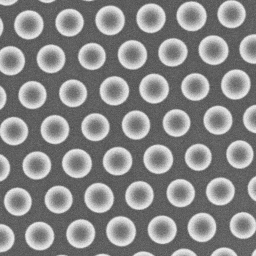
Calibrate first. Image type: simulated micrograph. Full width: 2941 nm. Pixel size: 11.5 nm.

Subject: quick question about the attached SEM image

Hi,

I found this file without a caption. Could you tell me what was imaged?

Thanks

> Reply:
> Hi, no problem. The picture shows an array of small figures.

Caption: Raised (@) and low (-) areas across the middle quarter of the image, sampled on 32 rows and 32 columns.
-----@@@@------@@@@-------------
--------------------------------
--------------------------------
-----------@@@------@@@@@-----@@
-@@@------@@@@@----@@@@@@@----@@
@@@@@----@@@@@@@---@@@@@@@---@@@
@@@@@----@@@@@@@---@@@@@@@---@@@
@@@@@@---@@@@@@@---@@@@@@@----@@
@@@@@----@@@@@@@----@@@@@------@
@@@@@-----@@@@@------@@@--------
-@@-----------------------------
----------------------------@---
----------------@@@@------@@@@--
-----@@@@@-----@@@@@@----@@@@@@-
@----@@@@@@----@@@@@@----@@@@@@-
@----@@@@@@----@@@@@@----@@@@@@-
@----@@@@@@----@@@@@@----@@@@@@-
@----@@@@@@----@@@@@@-----@@@@--
------@@@@-------@@-------------
--------------------------------
----------------------@@@-------
--@@-------@@@@@-----@@@@@-----@
@@@@@@----@@@@@@----@@@@@@@----@
@@@@@@@---@@@@@@@---@@@@@@@---@@
@@@@@@@---@@@@@@@---@@@@@@@----@
@@@@@@@---@@@@@@@---@@@@@@@----@
@@@@@@-----@@@@@-----@@@@@------
-@@@@@------@@@-----------------
--------------------------------
------------------@@-------@@@@-
-------@@@@-----@@@@@-----@@@@@@
@-----@@@@@@----@@@@@@----@@@@@@